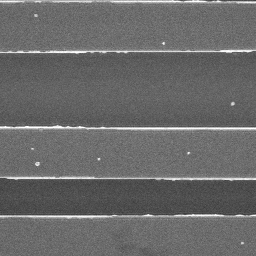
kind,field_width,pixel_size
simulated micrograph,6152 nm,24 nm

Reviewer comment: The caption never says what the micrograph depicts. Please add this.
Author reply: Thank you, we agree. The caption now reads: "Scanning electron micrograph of lines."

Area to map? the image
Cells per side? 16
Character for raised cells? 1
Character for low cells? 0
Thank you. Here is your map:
1111111111111111
1111111111111111
1111111111111111
0000000000000000
0000000000000000
0000000000000000
0000000000000000
0000000000000000
1111111111111111
1111111111111111
1111111111111111
0000000000000000
0000000000000000
0000000001011111
1111111111111111
1111111111111111